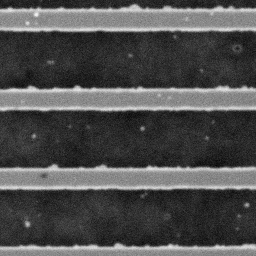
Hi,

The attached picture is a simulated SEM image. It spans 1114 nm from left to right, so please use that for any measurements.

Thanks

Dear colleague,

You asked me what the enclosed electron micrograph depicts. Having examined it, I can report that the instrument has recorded lines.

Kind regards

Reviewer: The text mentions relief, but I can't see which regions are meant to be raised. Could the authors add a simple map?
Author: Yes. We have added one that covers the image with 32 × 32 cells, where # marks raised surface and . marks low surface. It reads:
................................
################################
################################
################################
................................
................................
................................
................................
................................
................................
................................
################################
################################
################################
................................
................................
................................
................................
................................
................................
................................
################################
################################
##############.#######...###.##.
................................
................................
................................
................................
................................
................................
................................
################################